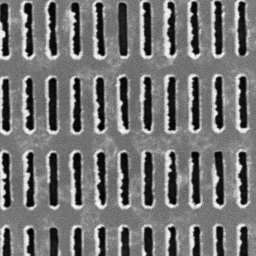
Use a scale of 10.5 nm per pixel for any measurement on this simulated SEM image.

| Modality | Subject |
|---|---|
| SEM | a regular array of holes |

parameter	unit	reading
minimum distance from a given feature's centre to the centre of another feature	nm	249